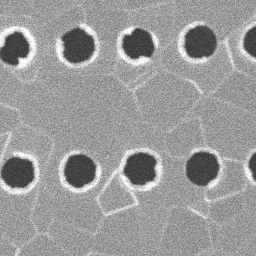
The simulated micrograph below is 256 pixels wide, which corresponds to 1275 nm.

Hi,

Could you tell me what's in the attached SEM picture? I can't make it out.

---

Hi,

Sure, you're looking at holes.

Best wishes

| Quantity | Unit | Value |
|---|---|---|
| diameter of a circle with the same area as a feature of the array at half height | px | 33.4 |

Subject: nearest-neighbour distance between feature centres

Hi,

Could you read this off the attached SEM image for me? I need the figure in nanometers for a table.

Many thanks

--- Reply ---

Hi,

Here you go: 302